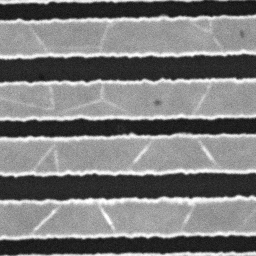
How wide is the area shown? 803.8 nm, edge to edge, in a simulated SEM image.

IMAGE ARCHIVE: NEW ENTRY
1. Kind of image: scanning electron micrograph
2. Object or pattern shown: lines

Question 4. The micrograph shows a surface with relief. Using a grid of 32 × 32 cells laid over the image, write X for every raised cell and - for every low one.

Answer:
--------------------------------
--------------------------------
--X---XXXXXXXXXXXXXXXXXXXXXXXXXX
XXXXXXXXXXXXXXXXXXXXXXXXXXXXXXXX
XXXXXXXXXXXXXXXXXXXXXXXXXXXXXXXX
XXXXXXXXXXXXXXXXXXXXXXXXXXXXXXXX
XXXXXXXXXXXXXXXXXXXXXXXXXXXXXXXX
--------------------------------
--------------------------------
--------------------------------
XXXXXXXXXXXXXXXXXXXXXXXXXXXXXXXX
XXXXXXXXXXXXXXXXXXXXXXXXXXXXXXXX
XXXXXXXXXXXXXXXXXXXXXXXXXXXXXXXX
XXXXXXXXXXXXXXXXXXXXXXXXXXXXXXXX
XXXXXXXXXXXXXXXXXXXXXXXXXXXXXXXX
--------------------------------
--------------------------------
XXXXXXXXXXXXXXXXXXXXXXXXXXXXXXXX
XXXXXXXXXXXXXXXXXXXXXXXXXXXXXXXX
XXXXXXXXXXXXXXXXXXXXXXXXXXXXXXXX
XXXXXXXXXXXXXXXXXXXXXXXXXXXXXXXX
XXXXXXXXXXXXXXXXXXXXXXXXXXXXXXXX
--------------------------------
--------------------------------
--------------------------------
XXXXXXXXXXXXXXXXXXXXXXXXXXXXXXXX
XXXXXXXXXXXXXXXXXXXXXXXXXXXXXXXX
XXXXXXXXXXXXXXXXXXXXXXXXXXXXXXXX
XXXXXXXXXXXXXXXXXXXXXXXXXXXXXXXX
XXXXXXXXXXXXXXXXX-X-XX----------
--------------------------------
--------------------------------